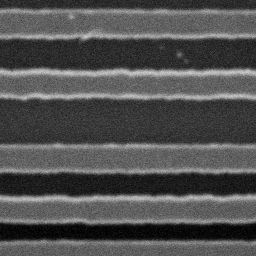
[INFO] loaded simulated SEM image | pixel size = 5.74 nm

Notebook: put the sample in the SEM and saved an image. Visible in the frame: lines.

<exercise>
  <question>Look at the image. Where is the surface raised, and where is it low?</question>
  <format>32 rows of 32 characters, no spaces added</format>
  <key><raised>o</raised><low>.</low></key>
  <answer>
................................
oooooooooooooooooooooooooooooooo
oooooooooooooooooooooooooooooooo
oooooooooooooooooooooooooooooooo
oooooooooooooooooooooooooooooooo
................................
................................
................................
................................
oooooooooooooooooooooooooooooooo
oooooooooooooooooooooooooooooooo
oooooooooooooooooooooooooooooooo
................................
................................
................................
................................
................................
................................
oooooooooooooooooooooooooooooooo
oooooooooooooooooooooooooooooooo
oooooooooooooooooooooooooooooooo
.oooooo..oooooooooooooo..ooooo.o
................................
................................
...............................o
oooooooooooooooooooooooooooooooo
oooooooooooooooooooooooooooooooo
oooooooooooooooooooooooooooooooo
................................
................................
oooooooooooooooooooooooooooooooo
oooooooooooooooooooooooooooooooo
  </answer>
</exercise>